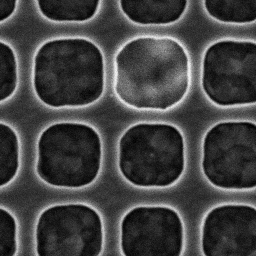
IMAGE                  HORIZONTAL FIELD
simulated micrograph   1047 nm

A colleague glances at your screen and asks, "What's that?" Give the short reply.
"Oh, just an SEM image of holes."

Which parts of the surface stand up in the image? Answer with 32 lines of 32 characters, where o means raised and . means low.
..ooo.......ooo........ooo......
..ooo.......ooo........ooo......
ooooooo...oooooo......ooooo.....
oooooooooooooooooooooooooooooooo
oooooooooooooooooooooooooooooooo
.ooooo......ooooooooooooooo.....
..ooo........ooooooooooooo......
..oo.........oooooooooooo.......
..oo.........oooooooooooo.......
..oo.........oooooooooooo.......
..oo.........oooooooooooo.......
..ooo........ooooooooooooo......
ooooo.......oooooooooooooo......
oooooooooooooooooooooooooooooooo
oooooooooooooooooooooooooooooooo
ooooooo...ooooooooooooooooo.....
..ooo.......oooo......oooo......
..ooo.......ooo........ooo......
..ooo........oo........oo.......
..ooo........oo........oo.......
..ooo.......ooo........oo.......
..ooo.......ooo........ooo......
.oooo.......oooo......oooo......
oooooooooooooooooooooooooooo...o
oooooooooooooooooooooooooooooooo
oooooooooooooooooooooooooooooooo
.ooooo......oooo......oooo......
..ooo........oo........ooo......
..ooo........oo........oo.......
..ooo........oo........oo.......
..ooo........oo........oo.......
..ooo........oo........oo.......